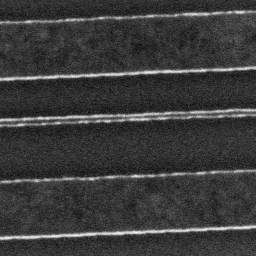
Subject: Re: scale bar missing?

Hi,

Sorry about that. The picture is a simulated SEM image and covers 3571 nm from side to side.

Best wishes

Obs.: lines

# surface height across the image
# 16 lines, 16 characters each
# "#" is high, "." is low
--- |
................
################
################
################
###########.....
................
................
................
................
................
................
################
################
################
#########.......
................